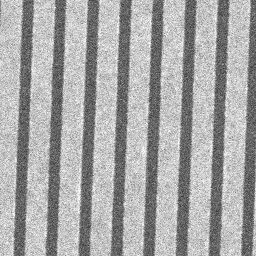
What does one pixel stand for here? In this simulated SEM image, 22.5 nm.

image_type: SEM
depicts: parallel lines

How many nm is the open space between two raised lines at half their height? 284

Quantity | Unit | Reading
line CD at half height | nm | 461